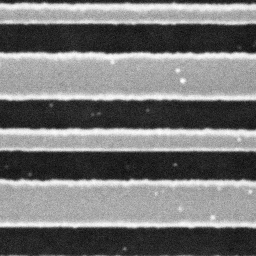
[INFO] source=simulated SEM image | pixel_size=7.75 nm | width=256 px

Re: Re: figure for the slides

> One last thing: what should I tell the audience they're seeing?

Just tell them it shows lines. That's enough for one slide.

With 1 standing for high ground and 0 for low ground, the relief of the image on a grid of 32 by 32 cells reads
00000000000000000000000000000000
11111111111111111111111111111111
11111111111111111111111111111111
00000000000000000000000000000000
00000000000000000000000000000000
00000000000000000000000000000000
00000000000000000000000000000000
11111111111111111111111111111111
11111111111111111111111111111111
11111111111111111111111111111111
11111111111111111111111111111111
11111111111111111111111111111111
00000000000000000000000000000000
00000000000000000000000000000000
00000000000000000000000000000000
00000000000000000000000000000000
11111111111111111111111111111111
11111111111111111111111111111111
11111111111111111111111111111111
00000000000000000000000000000000
00000000000000000000000000000000
00000000000000000000000000000000
10000000000000000000000000000000
11111111111111111111111111111111
11111111111111111111111111111111
11111111111111111111111111111111
11111111111111111111111111111111
11111111111111111111111111111111
00000000000000000000000000000000
00000000000000000000000000000000
00000000000000000000000000000000
00000000000000000000000000000000